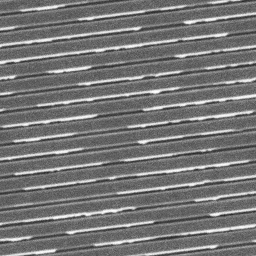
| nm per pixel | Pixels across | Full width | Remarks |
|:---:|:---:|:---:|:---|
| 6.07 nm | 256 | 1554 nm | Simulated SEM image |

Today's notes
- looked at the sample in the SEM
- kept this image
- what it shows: parallel lines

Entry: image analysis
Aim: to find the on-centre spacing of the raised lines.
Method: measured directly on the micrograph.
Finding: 97.9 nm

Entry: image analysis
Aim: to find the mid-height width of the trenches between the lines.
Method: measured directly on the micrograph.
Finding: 20.3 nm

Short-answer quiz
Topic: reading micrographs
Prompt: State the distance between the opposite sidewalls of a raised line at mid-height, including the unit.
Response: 81.3 nm